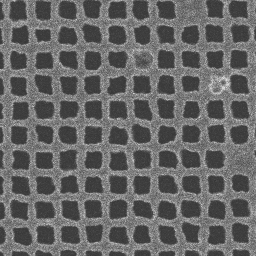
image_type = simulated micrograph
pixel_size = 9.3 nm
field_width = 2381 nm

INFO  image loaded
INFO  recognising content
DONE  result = a regular array of holes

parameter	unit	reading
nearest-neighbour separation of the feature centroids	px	23.8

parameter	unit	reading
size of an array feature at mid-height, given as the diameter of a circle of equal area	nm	174